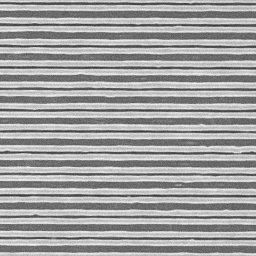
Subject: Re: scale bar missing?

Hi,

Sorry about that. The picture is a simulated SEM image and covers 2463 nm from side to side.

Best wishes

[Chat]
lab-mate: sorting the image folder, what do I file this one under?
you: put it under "parallel lines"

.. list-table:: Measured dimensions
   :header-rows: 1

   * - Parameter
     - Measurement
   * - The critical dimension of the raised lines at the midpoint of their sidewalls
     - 50.5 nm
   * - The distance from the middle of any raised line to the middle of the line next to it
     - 103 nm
